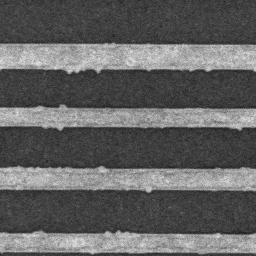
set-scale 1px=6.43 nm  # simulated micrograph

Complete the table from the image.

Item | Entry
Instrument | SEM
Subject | one or a few lines or trenches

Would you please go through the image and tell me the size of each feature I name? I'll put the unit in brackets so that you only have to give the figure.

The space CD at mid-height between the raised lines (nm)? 272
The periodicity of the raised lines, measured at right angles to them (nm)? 398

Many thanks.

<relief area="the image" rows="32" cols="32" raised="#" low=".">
................................
................................
................................
................................
................................
.............##...#.............
################################
################################
#..#############################
................................
................................
................................
................................
#..###.#........................
################################
################################
................................
................................
................................
................................
................................
################################
################################
################################
................................
................................
................................
................................
................................
################################
################################
#..........##...###.....########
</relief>